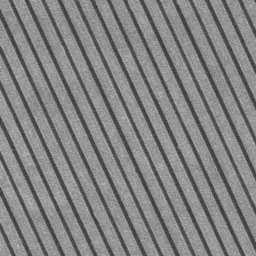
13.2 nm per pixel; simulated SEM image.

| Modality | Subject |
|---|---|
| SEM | parallel lines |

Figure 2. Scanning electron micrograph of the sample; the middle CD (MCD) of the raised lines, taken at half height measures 130 nm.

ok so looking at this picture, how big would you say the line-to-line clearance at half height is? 59.7 nm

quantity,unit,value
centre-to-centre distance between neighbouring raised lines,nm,196